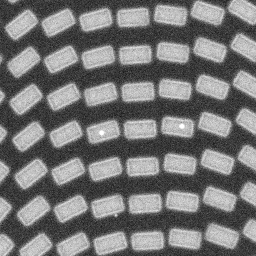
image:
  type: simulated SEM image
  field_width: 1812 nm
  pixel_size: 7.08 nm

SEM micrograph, an array of small figures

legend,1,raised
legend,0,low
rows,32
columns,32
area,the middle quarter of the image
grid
11111001111111111111111111111111
11111111111111111111111111111111
11111111111111111111111111111111
11111111111111111111111111111111
11111111111111111111111100001111
10111111110011100000001100000001
00011100000001100000001100000001
00001000000001100000001100000001
00011100000001100000001111111001
01111100011111111111111111111111
11111111111111111111111111111111
11111111111111111111111111111111
11111111111111111111111111111111
11111111111111111111111111111111
11111111111101111110001110000000
10011111000001100000000110000100
00001100000001100000000110000000
00001100010001100000000111110000
00011110000111111111111111111111
11111111111111111111111111111111
11111111111111111111111111111111
11111111111111111111111111111111
11111111111111111111111111111111
11111111111111111111111111000001
11001111110000110000000110000000
00001110000000110000000110000000
00000110000000110000000111000000
00001110000001111000011111111111
00111110011111111111111111111111
11111111111111111111111111111111
11111111111111111111111111111111
11111111111111111111111111111111